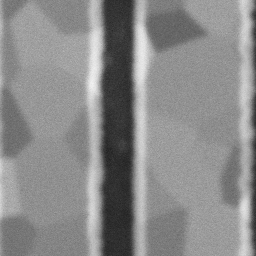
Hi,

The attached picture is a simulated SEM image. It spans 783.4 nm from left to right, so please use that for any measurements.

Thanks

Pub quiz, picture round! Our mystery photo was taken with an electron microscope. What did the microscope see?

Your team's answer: one or a few lines or trenches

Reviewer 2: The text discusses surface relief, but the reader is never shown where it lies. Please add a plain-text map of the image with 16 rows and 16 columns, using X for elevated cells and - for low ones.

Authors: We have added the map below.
XXXXXX---XXXXXX-
XXXXXX---XXXXXXX
XXXXXX---XXXXXXX
XXXXXX---XXXXXXX
XXXXXX---XXXXXXX
XXXXXX---XXXXXXX
XXXXXX---XXXXXXX
XXXXXX---XXXXXXX
XXXXXX---XXXXXXX
XXXXXX---XXXXXXX
XXXXXX---XXXXXXX
XXXXXX---XXXXXX-
XXXXXX---XXXXXXX
XXXXXX---XXXXXX-
XXXXXX---XXXXXX-
XXXXXX---XXXXXX-